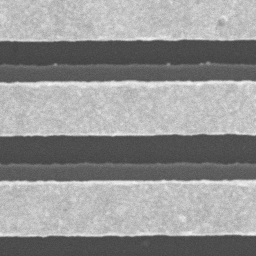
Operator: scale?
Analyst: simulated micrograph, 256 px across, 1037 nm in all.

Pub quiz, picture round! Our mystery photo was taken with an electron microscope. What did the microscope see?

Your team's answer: lines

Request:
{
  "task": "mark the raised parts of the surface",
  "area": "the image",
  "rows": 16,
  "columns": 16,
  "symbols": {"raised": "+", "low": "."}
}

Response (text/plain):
++++++++++++++++
++++++++++++++++
++++++++++++.++.
................
................
++++++++++++++++
++++++++++++++++
++++++++++++++++
................
................
................
++++++++++++++++
++++++++++++++++
++++++++++++++++
++++++++++++++++
................